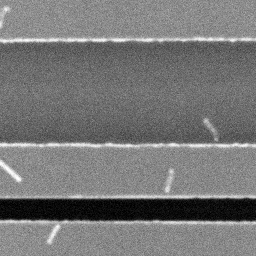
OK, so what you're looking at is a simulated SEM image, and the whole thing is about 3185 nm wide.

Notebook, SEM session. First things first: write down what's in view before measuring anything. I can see lines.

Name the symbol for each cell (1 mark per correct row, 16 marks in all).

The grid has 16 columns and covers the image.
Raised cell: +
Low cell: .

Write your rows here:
++++++++++++++++
++++++++++++++++
++++++++++++..+.
................
................
................
................
................
................
++++++++++++++++
++++++++++++++++
++++++++++++++++
................
................
++++++++++++++++
++++++++++++++++